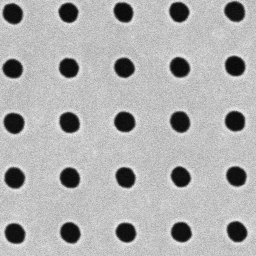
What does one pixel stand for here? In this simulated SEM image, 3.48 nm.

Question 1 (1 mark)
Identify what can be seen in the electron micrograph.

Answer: a regular array of holes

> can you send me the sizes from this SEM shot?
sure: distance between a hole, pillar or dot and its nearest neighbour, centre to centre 191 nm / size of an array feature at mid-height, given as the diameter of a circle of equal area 67.5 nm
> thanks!